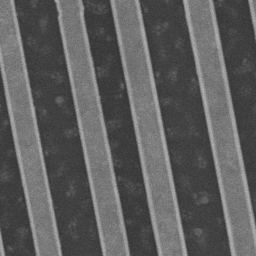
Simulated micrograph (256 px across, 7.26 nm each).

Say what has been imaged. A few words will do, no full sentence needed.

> one or a few lines or trenches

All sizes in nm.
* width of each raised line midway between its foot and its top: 184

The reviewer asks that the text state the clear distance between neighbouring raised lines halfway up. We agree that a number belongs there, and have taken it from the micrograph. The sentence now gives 41.6 px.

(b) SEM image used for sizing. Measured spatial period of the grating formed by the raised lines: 0.465 microns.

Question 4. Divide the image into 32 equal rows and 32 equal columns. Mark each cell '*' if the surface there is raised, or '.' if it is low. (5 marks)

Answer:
**.....***....***......***.....*
**.....***....***......****....*
**.....***....****......***.....
**......***....***......***.....
**......***....***......***.....
***.....***....***......***.....
***.....***....***......****....
***.....***....****......***....
***......***....***......***....
***......***....***......***....
.***.....***....***......***....
.***.....***....***......****...
.***.....***....****......***...
.***.....****....***......***...
.***......***....***......***...
..***.....***....***......***...
..***.....***....***......****..
..***.....***....****.....****..
..***.....****...****......***..
..***......***....***......***..
..***......***....***......***..
...***.....***....***......***..
...***.....***....***......****.
...***.....****...****......***.
...***......***...****......***.
...***......***....***......***.
....***.....***....***......***.
....***.....***....***......****
....***.....***....****......***
....***......***....***......***
....***......***....***......***
.....***.....***....***......***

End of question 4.